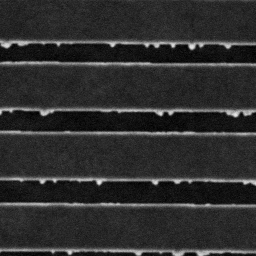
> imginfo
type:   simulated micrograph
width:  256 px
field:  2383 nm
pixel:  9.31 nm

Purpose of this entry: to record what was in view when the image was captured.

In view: lines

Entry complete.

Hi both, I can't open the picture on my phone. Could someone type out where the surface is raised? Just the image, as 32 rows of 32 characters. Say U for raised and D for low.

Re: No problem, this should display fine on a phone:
UUUUUUUUUUUUUUUUUUUUUUUUUUUUUUUU
UUUUUUUUUUUUUUUUUUUUUUUUUUUUUUUU
UUUUUUUUUUUUUUUUUUUUUUUUUUUUUUUU
UUUUUUUUUUUUUUUUUUUUUUUUUUUUUUUU
UUUUUUUUUUUUUUUUUUUUUUUUUUUUUUUU
UUUDDDDDDDDDDDUDDDUUDUDUUUDUUUUU
DDDDDDDDDDDDDDDDDDDDDDDDDDDDDDDD
DDDDDDDDDDDDDDDDDDDDDDDDDDDDDDDD
UUUUUUUUUUUUUUUUUUUUUUUUUUUUUUUU
UUUUUUUUUUUUUUUUUUUUUUUUUUUUUUUU
UUUUUUUUUUUUUUUUUUUUUUUUUUUUUUUU
UUUUUUUUUUUUUUUUUUUUUUUUUUUUUUUU
UUUUUUUUUUUUUUUUUUUUUUUUUUUUUUUU
UUUUUUUUUUUUUUUUUUUUUUUUUUUUUUUU
DDDDDDDDDDDDDDDDDDDDDDDDDDDDDDDD
DDDDDDDDDDDDDDDDDDDDDDDDDDDDDDDD
UUUUDDDDUDDDDDDDDDDDDDDDDDDDDDDD
UUUUUUUUUUUUUUUUUUUUUUUUUUUUUUUU
UUUUUUUUUUUUUUUUUUUUUUUUUUUUUUUU
UUUUUUUUUUUUUUUUUUUUUUUUUUUUUUUU
UUUUUUUUUUUUUUUUUUUUUUUUUUUUUUUU
UUUUUUUUUUUUUUUUUUUUUUUUUUUUUUUU
DDDDDUUDDUUUUUUUUUUUUUUUUUUUUUUU
DDDDDDDDDDDDDDDDDDDDDDDDDDDDDDDD
DDDDDDDDDDDDDDDDDDDDDDDDDDDDDDDD
UUUUUUUUUUDDUUUDDDDDDDDDDDDDDDDD
UUUUUUUUUUUUUUUUUUUUUUUUUUUUUUUU
UUUUUUUUUUUUUUUUUUUUUUUUUUUUUUUU
UUUUUUUUUUUUUUUUUUUUUUUUUUUUUUUU
UUUUUUUUUUUUUUUUUUUUUUUUUUUUUUUU
UUUUUUUUUUUUUUUUUUUUUUUUUUUUUUUU
DDDDDDDDUDDDDDDDUUDDDUUDUUUUUUUU